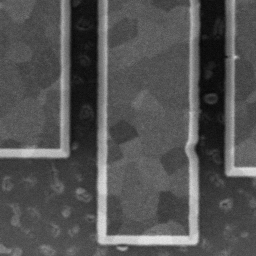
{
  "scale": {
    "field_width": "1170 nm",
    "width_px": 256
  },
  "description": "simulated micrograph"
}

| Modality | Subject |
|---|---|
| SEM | one or a few lines or trenches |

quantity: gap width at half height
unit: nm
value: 168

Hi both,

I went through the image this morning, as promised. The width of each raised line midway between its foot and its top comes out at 418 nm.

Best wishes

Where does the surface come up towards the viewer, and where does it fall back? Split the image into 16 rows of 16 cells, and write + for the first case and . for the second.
++++..++++++..++
++++..++++++..++
++++..++++++..++
++++..++++++..++
++++..++++++..++
++++..++++++..++
++++..++++++..++
++++..++++++..++
++++..++++++..++
++++..++++++..++
......++++++...+
......++++++....
......++++++....
......++++++....
......++++++....
................